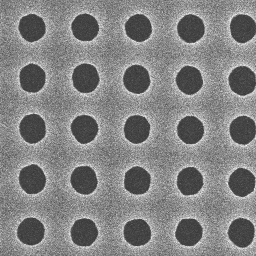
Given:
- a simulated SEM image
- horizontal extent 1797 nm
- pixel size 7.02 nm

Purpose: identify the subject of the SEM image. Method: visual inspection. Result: a regular array of holes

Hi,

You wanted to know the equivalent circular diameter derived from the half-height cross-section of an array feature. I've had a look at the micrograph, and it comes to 0.196 µm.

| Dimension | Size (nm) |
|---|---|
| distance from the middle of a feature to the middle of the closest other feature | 356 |